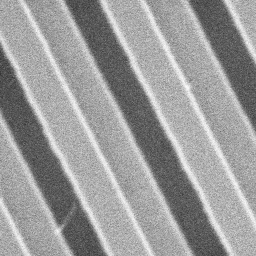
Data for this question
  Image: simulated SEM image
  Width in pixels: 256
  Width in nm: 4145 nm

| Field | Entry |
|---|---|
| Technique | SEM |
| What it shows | lines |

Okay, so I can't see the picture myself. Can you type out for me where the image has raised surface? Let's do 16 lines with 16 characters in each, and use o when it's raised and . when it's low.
oooo...ooooo..oo
ooooo..ooooo...o
ooooo...ooooo..o
.ooooo..ooooo...
.ooooo...ooooo..
..ooooo..ooooo..
..ooooo...ooooo.
...ooooo..ooooo.
o..ooooo...ooooo
o...ooooo..ooooo
oo..ooooo...oooo
oo...ooooo..oooo
ooo..ooooo...ooo
ooo...ooooo..ooo
oooo..ooooo...oo
oooo...ooooo..oo